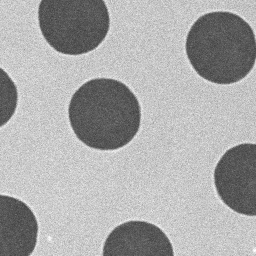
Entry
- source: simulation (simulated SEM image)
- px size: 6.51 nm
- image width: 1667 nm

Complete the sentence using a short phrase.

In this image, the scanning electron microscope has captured holes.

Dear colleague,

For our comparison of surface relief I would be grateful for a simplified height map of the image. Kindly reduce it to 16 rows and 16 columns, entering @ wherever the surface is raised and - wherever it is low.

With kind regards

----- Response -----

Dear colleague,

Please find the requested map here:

@@-----@@@@@@@@@
@@-----@@@@@---@
@@@---@@@@@@----
@@@@@@@@@@@@----
@@@@@@@@@@@@----
-@@@@---@@@@@@@@
-@@@-----@@@@@@@
-@@@-----@@@@@@@
@@@@@---@@@@@@@@
@@@@@@@@@@@@@@--
@@@@@@@@@@@@@---
@@@@@@@@@@@@@---
-@@@@@@@@@@@@@--
--@@@@@@@@@@@@@@
--@@@@@---@@@@@@
--@@@@-----@@@@@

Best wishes